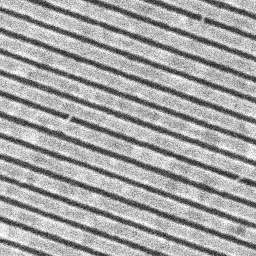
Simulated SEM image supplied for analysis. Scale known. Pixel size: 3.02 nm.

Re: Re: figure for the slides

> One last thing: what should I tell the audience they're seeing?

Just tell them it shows parallel lines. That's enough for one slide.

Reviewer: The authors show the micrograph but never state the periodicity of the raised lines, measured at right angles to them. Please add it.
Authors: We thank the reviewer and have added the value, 59.6 nanometres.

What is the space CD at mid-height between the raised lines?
22.4 nm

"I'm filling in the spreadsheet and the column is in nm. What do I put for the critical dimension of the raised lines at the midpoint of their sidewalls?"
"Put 39.1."